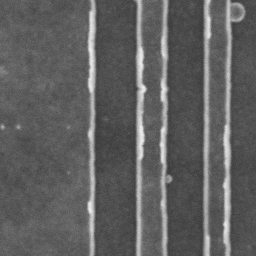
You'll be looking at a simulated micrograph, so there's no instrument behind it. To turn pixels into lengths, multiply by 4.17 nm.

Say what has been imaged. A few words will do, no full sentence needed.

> one or a few lines or trenches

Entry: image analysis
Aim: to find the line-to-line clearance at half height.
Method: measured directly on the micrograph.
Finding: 42.4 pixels